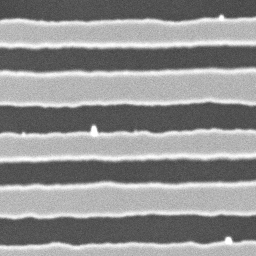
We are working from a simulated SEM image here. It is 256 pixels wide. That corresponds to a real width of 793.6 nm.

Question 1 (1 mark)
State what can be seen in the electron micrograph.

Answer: lines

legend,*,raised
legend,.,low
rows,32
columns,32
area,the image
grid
................................
................................
.**...............*......*******
********************************
********************************
********************************
................................
................................
................................
********************************
********************************
********************************
********************************
................................
................................
................................
...........*.....*...***********
********************************
********************************
********************************
................................
................................
................................
********************************
********************************
********************************
********************************
................................
................................
................................
......**........**.....**.******
********************************